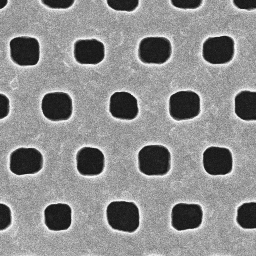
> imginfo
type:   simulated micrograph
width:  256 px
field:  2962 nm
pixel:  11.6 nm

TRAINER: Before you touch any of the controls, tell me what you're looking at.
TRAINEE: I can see a regular array of holes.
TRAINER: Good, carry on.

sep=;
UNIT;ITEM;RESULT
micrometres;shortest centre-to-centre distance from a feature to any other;0.735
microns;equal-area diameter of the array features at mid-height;0.352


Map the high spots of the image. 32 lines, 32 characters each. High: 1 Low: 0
01111100011111000111110001111000
11111111111111111111111111111111
11111111111111111111111111111111
11111111111111111111111111111111
11111111111111111111111111111111
10000111100001111100011111000111
10000111100001111000011110000111
11000111110001111100011111000111
11111111111111111111111111111111
11111111111111111111111111111111
11111111111111111111111111111111
11111111111111111111110011111100
01111000011111000111100001111000
01111000011111000111100001111000
01111100011111000111100011111100
11111111111111111111111111111111
11111111111111111111111111111111
11111111111111111111111111111111
11101111111011111100011111001111
10000111110001111000011110000111
10000111110001111000011110000111
11000111110001111100011111000111
11111111111111111111111111111111
11111111111111111111111111111111
11111111111111111111111111111111
11111110111111000111111011111100
01111100011110000111100001111100
01111100011110000111100001111100
01111100111111000111110011111110
11111111111111111111111111111111
11111111111111111111111111111111
11111111111111111111111111111111